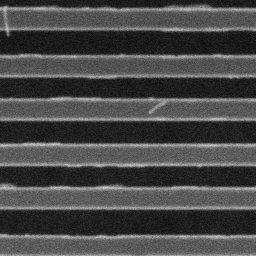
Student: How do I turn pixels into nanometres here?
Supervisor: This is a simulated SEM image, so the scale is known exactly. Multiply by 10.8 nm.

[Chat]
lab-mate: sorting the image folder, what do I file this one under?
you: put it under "lines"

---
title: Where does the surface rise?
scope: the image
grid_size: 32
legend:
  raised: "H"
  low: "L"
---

LLLLLLLLLLLLLLLLLLLLLLLLLLLLLLLL
HHHHHHHHHHHHHHHHHHHHHHHHHHHHHHHH
HHHHHHHHHHHHHHHHHHHHHHHHHHHHHHHH
HHHHHHHHHHHHHHHHHHHHHHHHHHHHHHHH
LLLLLLLLLLLLLLLLLLLLLLLLLLLLLLLL
LLLLLLLLLLLLLLLLLLLLLLLLLLLLLLLL
LLLLLLLLLLLLLLLLLLLLLLLLLLLLLLLL
HHHHHHHHHHHHHHHHHHHHHHHHHHHHHHHH
HHHHHHHHHHHHHHHHHHHHHHHHHHHHHHHH
HHHHHHHHHHHHHHHHHHHHHHHHHHHHHHHH
LLLLLLLLLLLLLLLLLLLLLLLLLLLLLLLL
LLLLLLLLLLLLLLLLLLLLLLLLLLLLLLLL
HHHHHHHHHHHHHHHHHHHHHHHHHHHHHHHH
HHHHHHHHHHHHHHHHHHHHHHHHHHHHHHHH
HHHHHHHHHHHHHHHHHHHHHHHHHHHHHHHH
LLLLLLLLLLLLLLLLLLLLLLLLLLLLLLLL
LLLLLLLLLLLLLLLLLLLLLLLLLLLLLLLL
LLLLLLLLLLLLLLLLLLLLLLLLLLLLLLLL
HHHHHHHHHHHHHHHHHHHHHHHHHHHHHHHH
HHHHHHHHHHHHHHHHHHHHHHHHHHHHHHHH
HHHHHHHHHHHHHHHHHHHHHHHHHHHHHHHH
LLLLLLLLLLLLLLLLLLLLLLLLLLLLLLLL
LLLLLLLLLLLLLLLLLLLLLLLLLLLLLLLL
HHHHHHHHHHHHHHHHHHHHHHHHHHHHHHHH
HHHHHHHHHHHHHHHHHHHHHHHHHHHHHHHH
HHHHHHHHHHHHHHHHHHHHHHHHHHHHHHHH
LLLLLLLLLLLLLLLLLLLLLLLLLLLLLLLL
LLLLLLLLLLLLLLLLLLLLLLLLLLLLLLLL
LLLLLLLLLLLLLLLLLLLLLLLLLLLLLLLL
HHHHHHHHHLLLLLLHHHHHHHHHHHHHHHHH
HHHHHHHHHHHHHHHHHHHHHHHHHHHHHHHH
HHHHHHHHHHHHHHHHHHHHHHHHHHHHHHHH